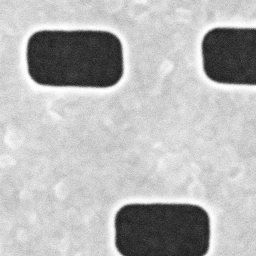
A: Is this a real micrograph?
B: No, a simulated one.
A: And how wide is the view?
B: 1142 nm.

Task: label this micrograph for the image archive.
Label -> holes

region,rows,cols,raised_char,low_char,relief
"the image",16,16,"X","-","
XXXXXXXXXXXXXXXX
XXXXXXXXXXXXXXXX
XX-----XXXXXX---
XX------XXXXX---
XX------XXXXX---
XXXXX-XXXXXXXXXX
XXXXXXXXXXXXXXXX
XXXXXXXXXXXXXXXX
XXXXXXXXXXXXXXXX
XXXXXXXXXXXXXXXX
XXXXXXXXXXXXXXXX
XXXXXXXXXXXXXXXX
XXXXXXXXXXXXXXXX
XXXXXXX------XXX
XXXXXXX------XXX
XXXXXXX------XXX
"